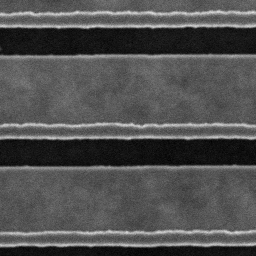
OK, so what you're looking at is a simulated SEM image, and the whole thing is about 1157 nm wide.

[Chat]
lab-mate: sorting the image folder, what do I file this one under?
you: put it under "lines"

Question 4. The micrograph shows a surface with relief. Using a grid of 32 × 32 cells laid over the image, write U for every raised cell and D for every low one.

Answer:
UUUUUUUUUUUUUUUUUUUUUUUUUUUUUUUU
UUUUUUUUUUUUUUUUUUUUUUUUUUUUUUUU
UUUUUUUUUUUUUUUUUUUUUUUUUUUUUUUU
DDDDDDDUDDUUDDDDDDDUDDDDDDDDDDDD
DDDDDDDDDDDDDDDDDDDDDDDDDDDDDDDD
DDDDDDDDDDDDDDDDDDDDDDDDDDDDDDDD
DDDDDDDDDDDDDDDDDDDDDDDDDDDDDDDD
UUUUUUUUUUUUUUUUUUUUUUUUUUUUUUUU
UUUUUUUUUUUUUUUUUUUUUUUUUUUUUUUU
UUUUUUUUUUUUUUUUUUUUUUUUUUUUUUUU
UUUUUUUUUUUUUUUUUUUUUUUUUUUUUUUU
UUUUUUUUUUUUUUUUUUUUUUUUUUUUUUUU
UUUUUUUUUUUUUUUUUUUUUUUUUUUUUUUU
UUUUUUUUUUUUUUUUUUUUUUUUUUUUUUUU
UUUUUUUUUUUUUUUUUUUUUUUUUUUUUUUU
UUUUUUUUUUUUUUUUUUUUUUUUUUUUUUUU
UUUUUUUUUUUUUUUUUUUUUUUUUUUUUUUU
DDDDDDDDDDDDDDDDDDDDDDDDDDDDDDDD
DDDDDDDDDDDDDDDDDDDDDDDDDDDDDDDD
DDDDDDDDDDDDDDDDDDDDDDDDDDDDDDDD
DDDDDDDDDDDDDDDDDDDDDDDDDDDDDDDD
UUUUUUUUUUUUUUUUUUUUUUUUUUUUUUUU
UUUUUUUUUUUUUUUUUUUUUUUUUUUUUUUU
UUUUUUUUUUUUUUUUUUUUUUUUUUUUUUUU
UUUUUUUUUUUUUUUUUUUUUUUUUUUUUUUU
UUUUUUUUUUUUUUUUUUUUUUUUUUUUUUUU
UUUUUUUUUUUUUUUUUUUUUUUUUUUUUUUU
UUUUUUUUUUUUUUUUUUUUUUUUUUUUUUUU
UUUUUUUUUUUUUUUUUUUUUUUUUUUUUUUU
UUUUUUUUUUUUUUUUUUUUUUUUUUUUUUUU
UUUUUUUUUUUUUUUUUUUUUUUUUUUUUUUU
DDDDDDDDDDDDDDDDDDDDDDDDDDDDDDDD